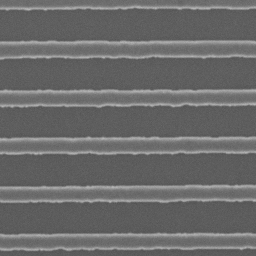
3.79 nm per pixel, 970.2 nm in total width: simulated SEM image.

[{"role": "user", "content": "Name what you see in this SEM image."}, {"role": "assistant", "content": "lines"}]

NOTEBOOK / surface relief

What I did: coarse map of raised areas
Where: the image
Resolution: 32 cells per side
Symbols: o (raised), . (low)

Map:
oooooooooooooooooooooooooooooooo
................................
................................
................................
................................
oooooooooooooooooooooooooooooooo
oooooooooooooooooooooooooooooooo
................................
................................
................................
................................
oooooooooooooooooooooooooooooooo
oooooooooooooooooooooooooooooooo
................................
................................
................................
................................
oooooooooooooooooooooooooooooooo
oooooooooooooooooooooooooooooooo
................................
................................
................................
................................
oooooooooooooooooooooooooooooooo
oooooooooooooooooooooooooooooooo
................................
................................
................................
................................
oooooooooooooooooooooooooooooooo
oooooooooooooooooooooooooooooooo
................................